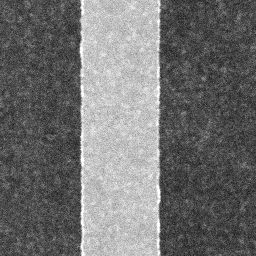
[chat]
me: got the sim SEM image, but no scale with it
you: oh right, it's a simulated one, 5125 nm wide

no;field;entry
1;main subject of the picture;one or a few lines or trenches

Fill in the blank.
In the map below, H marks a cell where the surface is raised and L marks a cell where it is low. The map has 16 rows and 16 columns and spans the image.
HHHHHLLLLLHHHHHH
HHHHHLLLLLHHHHHH
HHHHHLLLLLHHHHHH
HHHHHLLLLLHHHHHH
HHHHHLLLLLHHHHHH
HHHHHLLLLLHHHHHH
HHHHHLLLLLHHHHHH
HHHHHLLLLLHHHHHH
HHHHHLLLLLHHHHHH
HHHHHLLLLLHHHHHH
HHHHHLLLLLHHHHHH
HHHHHLLLLLHHHHHH
HHHHHLLLLLHHHHHH
HHHHHLLLLLHHHHHH
HHHHHLLLLLHHHHHH
HHHHHLLLLLHHHHHH